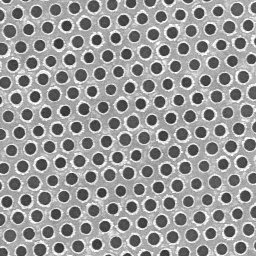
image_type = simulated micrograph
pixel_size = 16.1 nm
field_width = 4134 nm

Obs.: a regular array of holes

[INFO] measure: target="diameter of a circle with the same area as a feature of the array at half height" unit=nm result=194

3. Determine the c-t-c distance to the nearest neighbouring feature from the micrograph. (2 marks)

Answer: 0.306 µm